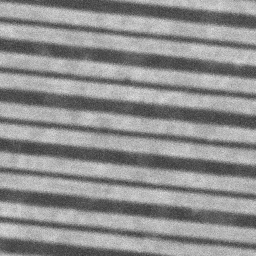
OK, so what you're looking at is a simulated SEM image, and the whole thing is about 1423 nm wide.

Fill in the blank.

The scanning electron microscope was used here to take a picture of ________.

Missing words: parallel lines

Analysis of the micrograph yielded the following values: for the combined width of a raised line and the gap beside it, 136 nm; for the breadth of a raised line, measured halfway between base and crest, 0.0726 microns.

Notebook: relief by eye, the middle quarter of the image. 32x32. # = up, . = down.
############....................
#####################...........
....############################
.............##.################
##.....................#########
#############...................
####################............
..############################..
............####################
.....................###########
...............................#
................................
########........................
##################..............
###########################.....
.........#######################
.................###############
#######.....................####
################................
##########################......
........########################
.................###############
..........................######
................................
####............................
##############..................
#######################.........
...#############################
.............###################
###...................##########
############...................#
######################..........